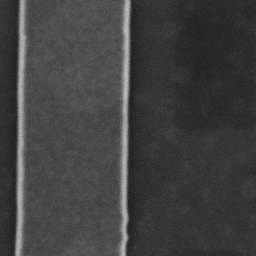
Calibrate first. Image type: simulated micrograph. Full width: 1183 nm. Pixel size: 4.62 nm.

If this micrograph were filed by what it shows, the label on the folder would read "one or a few lines or trenches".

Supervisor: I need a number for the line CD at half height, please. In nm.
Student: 492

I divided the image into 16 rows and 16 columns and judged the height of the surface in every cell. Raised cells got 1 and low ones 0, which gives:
0111111100000000
0111111100000000
0111111100000000
0111111100000000
0111111100000000
0111111100000000
0111111100000000
0111111100000000
0111111100000000
0111111100000000
0111111100000000
0111111100000000
0111111100000000
0111111100000000
0111111100000000
0111111100000000